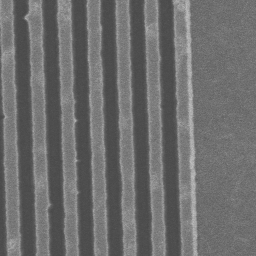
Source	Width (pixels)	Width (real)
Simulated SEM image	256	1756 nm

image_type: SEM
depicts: parallel lines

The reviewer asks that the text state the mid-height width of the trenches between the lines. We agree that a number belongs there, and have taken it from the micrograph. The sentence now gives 98.6 nm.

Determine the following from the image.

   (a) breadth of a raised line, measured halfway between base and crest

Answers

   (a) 0.103 µm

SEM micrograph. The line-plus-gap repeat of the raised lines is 199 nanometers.